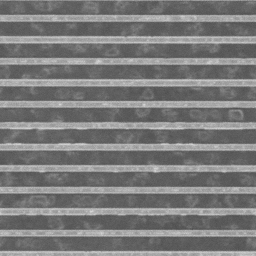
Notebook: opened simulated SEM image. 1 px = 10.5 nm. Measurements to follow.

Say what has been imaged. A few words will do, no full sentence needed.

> parallel lines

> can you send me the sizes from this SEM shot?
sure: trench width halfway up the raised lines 15.6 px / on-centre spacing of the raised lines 224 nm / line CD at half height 0.0575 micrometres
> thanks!